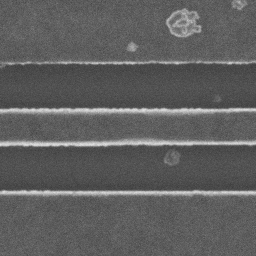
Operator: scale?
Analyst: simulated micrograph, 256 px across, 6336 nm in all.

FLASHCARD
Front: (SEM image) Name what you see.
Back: lines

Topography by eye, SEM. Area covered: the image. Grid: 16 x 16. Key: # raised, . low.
################
################
################
################
................
................
................
################
################
................
................
................
################
################
################
################